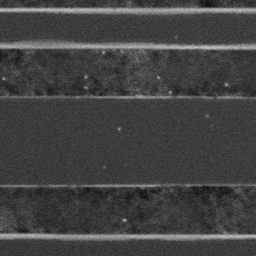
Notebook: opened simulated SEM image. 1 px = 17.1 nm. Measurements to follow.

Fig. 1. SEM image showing lines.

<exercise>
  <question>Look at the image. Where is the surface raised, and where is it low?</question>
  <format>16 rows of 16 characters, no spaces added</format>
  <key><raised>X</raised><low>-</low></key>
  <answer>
----------------
XXXXXXXXXXXXXXXX
XXXXXXXXXXXXXXXX
----------------
----------------
----------------
XXXXXXXXXXXXXXXX
XXXXXXXXXXXXXXXX
XXXXXXXXXXXXXXXX
XXXXXXXXXXXXXXXX
XXXXXXXXXXXXXXXX
XXXXXXXXXXXXXXXX
----------------
----------------
----------------
XXXXXXXXXXXXXXXX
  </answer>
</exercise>